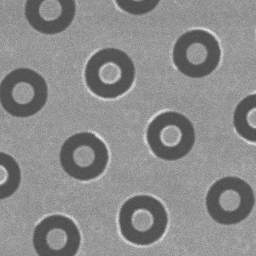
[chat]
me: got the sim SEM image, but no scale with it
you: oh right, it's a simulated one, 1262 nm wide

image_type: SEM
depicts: ring-shaped grooves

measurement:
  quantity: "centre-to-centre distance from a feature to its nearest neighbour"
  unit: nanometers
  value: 428